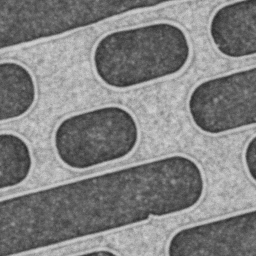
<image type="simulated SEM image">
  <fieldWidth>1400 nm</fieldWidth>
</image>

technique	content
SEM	one or a few lines or trenches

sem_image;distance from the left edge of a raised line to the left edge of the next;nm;370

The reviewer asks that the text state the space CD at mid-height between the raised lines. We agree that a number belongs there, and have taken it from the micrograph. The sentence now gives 308 nanometres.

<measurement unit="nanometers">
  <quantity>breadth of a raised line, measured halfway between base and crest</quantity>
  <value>78.7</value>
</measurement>